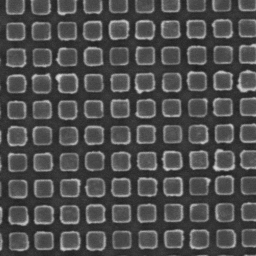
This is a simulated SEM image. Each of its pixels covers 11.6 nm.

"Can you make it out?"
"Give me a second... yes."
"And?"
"a regular array of raised bodies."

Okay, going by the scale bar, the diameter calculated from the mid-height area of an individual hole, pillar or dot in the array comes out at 233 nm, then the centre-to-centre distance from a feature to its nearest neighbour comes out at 296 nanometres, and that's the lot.